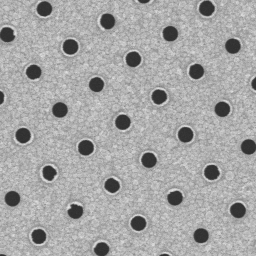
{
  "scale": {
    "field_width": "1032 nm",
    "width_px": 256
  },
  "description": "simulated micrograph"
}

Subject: a regular array of holes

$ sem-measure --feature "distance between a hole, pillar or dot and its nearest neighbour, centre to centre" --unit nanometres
180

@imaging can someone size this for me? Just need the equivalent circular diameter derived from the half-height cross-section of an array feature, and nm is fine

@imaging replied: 60.8